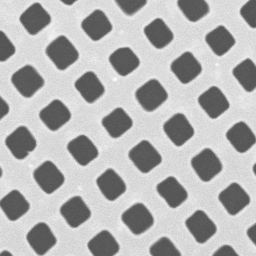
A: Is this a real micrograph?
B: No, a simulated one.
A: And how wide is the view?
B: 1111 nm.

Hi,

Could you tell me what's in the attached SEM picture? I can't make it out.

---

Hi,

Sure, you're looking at a regular array of holes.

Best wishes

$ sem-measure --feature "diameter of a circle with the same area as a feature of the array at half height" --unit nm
125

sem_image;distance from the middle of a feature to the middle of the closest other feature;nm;188